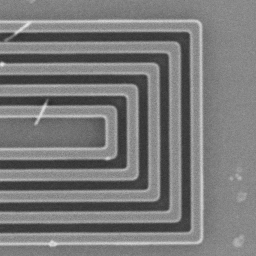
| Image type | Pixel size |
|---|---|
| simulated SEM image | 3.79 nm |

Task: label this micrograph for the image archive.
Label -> groups of lines, slits or small figures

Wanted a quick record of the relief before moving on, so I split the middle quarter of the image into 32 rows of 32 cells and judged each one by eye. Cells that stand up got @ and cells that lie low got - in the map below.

@@@@@@@@@@@@@@@@@@@@@@@---@@@---
@@@@@@@@@@@@@@@@@@@@@@@@--@@@---
--------------------@@@@--@@@---
---------------------@@@--@@@---
---------------------@@@--@@@---
@@@@@@@@@@@@@@@@@@---@@@--@@@---
@@@@@@@@@@@@@@@@@@---@@@--@@@---
@@@@@@@@@@@@@@@@@@---@@@--@@@---
----------------@@---@@@--@@@---
----------------@@---@@@--@@@---
----------------@@---@@@--@@@---
@@@@@@@@@@@@@---@@---@@@--@@@---
@@@@@@@@@@@@@---@@---@@@--@@@---
----------@@@---@@---@@@--@@@---
-----------@@---@@---@@@--@@@---
-----------@@---@@---@@@--@@@---
-----------@@---@@---@@@--@@@---
-----------@@---@@---@@@--@@@---
-----------@@---@@---@@@--@@@---
-----------@@---@@---@@@--@@@---
----------@@@---@@---@@@--@@@---
@@@@@@@@@@@@@---@@---@@@--@@@---
@@@@@@@@@@@@@---@@---@@@--@@@---
@@@@@@@@@@@@----@@---@@@--@@@---
----------------@@---@@@--@@@---
----------------@@---@@@--@@@---
@@@@@@@@@@@@@@@@@@---@@@---@@---
@@@@@@@@@@@@@@@@@@---@@@---@@---
@@@@@@@@@@@@@@@@@@---@@@---@@---
---------------------@@@---@@---
---------------------@@@---@@---
---------------------@@@---@@---